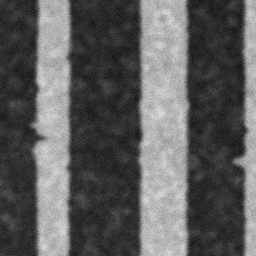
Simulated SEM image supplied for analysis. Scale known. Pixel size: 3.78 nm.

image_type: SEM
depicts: one or a few lines or trenches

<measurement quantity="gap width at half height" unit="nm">231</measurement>